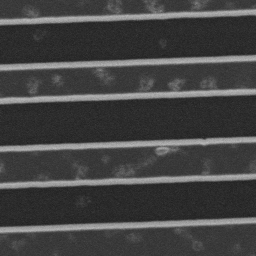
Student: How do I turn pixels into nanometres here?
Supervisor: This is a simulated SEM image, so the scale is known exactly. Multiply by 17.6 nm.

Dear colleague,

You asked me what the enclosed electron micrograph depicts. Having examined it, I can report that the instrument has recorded one or a few lines or trenches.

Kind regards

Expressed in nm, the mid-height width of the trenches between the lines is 798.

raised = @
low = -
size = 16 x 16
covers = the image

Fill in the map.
@@@@@@@@@@@@@@@@
----------------
----------------
----------------
@@@@@@@@@@@@@@@@
@@@@@@@@@@@@@@@@
----------------
----------------
----------------
@@@@@@@@@@@@@@@@
@@@@@@@@@@@@@@@@
@@--------------
----------------
----------------
@@@@@@@@@@@@@@@@
@@@@@@@@@@@@@@@@